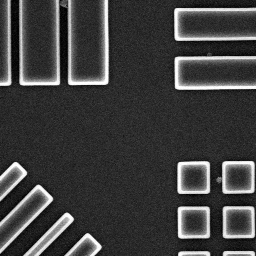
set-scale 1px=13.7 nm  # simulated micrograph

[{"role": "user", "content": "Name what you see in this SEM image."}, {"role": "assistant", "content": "groups of lines, slits or small figures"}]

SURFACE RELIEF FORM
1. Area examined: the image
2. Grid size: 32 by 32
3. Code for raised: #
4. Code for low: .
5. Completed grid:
#..####..####...................
#..####..####.........##########
#..####..####.........##########
#..####..####.........##########
#..####..####.........##########
#..####..####...................
#..####..####...................
#..####..####.........##########
#..####..####.........##########
#..####..####.........##########
......................##########
................................
................................
................................
................................
................................
................................
................................
................................
................................
.......................###..###.
.##...................####..####
##....................####..####
#.....................####..####
....##..........................
...###..........................
..###.................####..####
.###....#.............####..####
###....#..............####..####
##....#................###..###.
#....#....##....................
....#....###....................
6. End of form